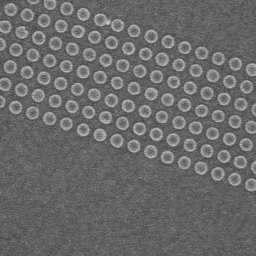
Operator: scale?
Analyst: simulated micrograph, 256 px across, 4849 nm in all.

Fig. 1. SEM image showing a regular array of raised bodies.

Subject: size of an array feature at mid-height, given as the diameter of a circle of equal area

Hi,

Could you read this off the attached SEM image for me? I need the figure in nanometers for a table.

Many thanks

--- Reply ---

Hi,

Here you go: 229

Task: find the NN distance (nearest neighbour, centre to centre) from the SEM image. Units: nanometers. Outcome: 334